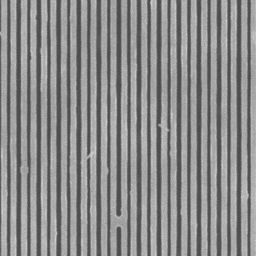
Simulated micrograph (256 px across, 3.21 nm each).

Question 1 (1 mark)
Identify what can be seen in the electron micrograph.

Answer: parallel lines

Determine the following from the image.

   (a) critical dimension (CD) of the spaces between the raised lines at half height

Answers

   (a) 0.0113 microns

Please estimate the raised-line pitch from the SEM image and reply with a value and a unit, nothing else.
32.1 nm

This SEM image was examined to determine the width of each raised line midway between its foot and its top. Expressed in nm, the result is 19.3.